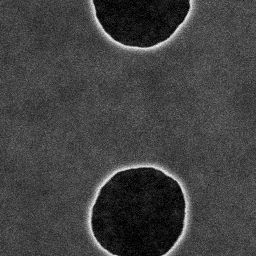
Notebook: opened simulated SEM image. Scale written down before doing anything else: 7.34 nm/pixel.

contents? holes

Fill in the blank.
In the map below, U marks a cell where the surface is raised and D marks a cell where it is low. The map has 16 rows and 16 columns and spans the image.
UUUUUUDDDDDDUUUU
UUUUUUDDDDDUUUUU
UUUUUUUDDDUUUUUU
UUUUUUUUUUUUUUUU
UUUUUUUUUUUUUUUU
UUUUUUUUUUUUUUUU
UUUUUUUUUUUUUUUU
UUUUUUUUUUUUUUUU
UUUUUUUUUUUUUUUU
UUUUUUUUUUUUUUUU
UUUUUUUUUUUUUUUU
UUUUUUUDDDDUUUUU
UUUUUUDDDDDDUUUU
UUUUUUDDDDDDUUUU
UUUUUUDDDDDUUUUU
UUUUUUUDDDDUUUUU